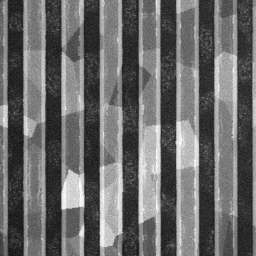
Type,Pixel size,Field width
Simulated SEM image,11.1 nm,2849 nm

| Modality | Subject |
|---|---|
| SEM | parallel lines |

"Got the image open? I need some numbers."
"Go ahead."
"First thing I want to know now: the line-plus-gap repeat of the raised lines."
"426 nanometers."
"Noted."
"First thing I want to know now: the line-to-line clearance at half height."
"224 nanometres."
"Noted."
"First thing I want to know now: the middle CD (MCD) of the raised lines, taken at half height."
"203 nm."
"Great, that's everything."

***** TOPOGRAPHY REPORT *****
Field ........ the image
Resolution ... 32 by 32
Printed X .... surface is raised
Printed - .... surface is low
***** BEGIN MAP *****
X--XX---XX---XX---XX--XX---XX---
X--XX---XX---XX---XX--XX---XX---
X--XX---XX---XX---XX--XX---XX---
X--XX---XX---XX---XX--XX---XX---
X--XX---XX---XX---XX--XX---XX---
X--XX---XX---XX---XX--XX---XX---
X--XX---XX---XX---XX--XX---XX---
X--XX---XX---XX---XX--XX---XX---
X--XX---XX---XX---XX--XX---XX---
X--XX---XX---XX---XX--XX---XX---
X--XX---XX---XX---XX--XX---XX---
X--XX---XX---XX---XX--XX---XX---
X--XX---XX---XX---XX--XX---XX---
X--XX---XX---XX---XX--XX---XX---
X--XX---XX---XX---XX--XX---XX---
X--XX---XX---XX---XX--XX---XX---
X--XX---XX---XX---XX--XX---XX---
X--XX---XX---XX---XX--XX---XX---
X--XX---XX---XX---XX--XX---XX---
X--XX---XX---XX---XX--XX---XX---
X--XX---XX---XX---XX--XX---XX---
X--XX---XX---XX---XX--XX---XX---
X--XX---XX---XX---XX--XX---XX---
X--XX---XX---XX---XX--XX---XX---
X--XX---XX---XX---XX--XX---XX---
X--XX---XX---XX---XX--XX---XX---
X--XX---XX---XX---XX--XX---XX---
X--XX---XX---XX---XX--XX---XX---
X--XX---XX---XX---XX--XX---XX---
X--XX---XX---XX---XX--XX---XX---
X--XX---XX---XX---XX--XX---XX---
X--XX---XX---XX---XX--XX---XX---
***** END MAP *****